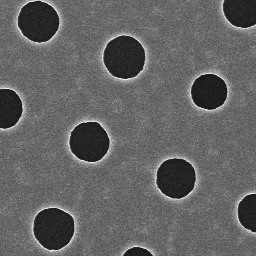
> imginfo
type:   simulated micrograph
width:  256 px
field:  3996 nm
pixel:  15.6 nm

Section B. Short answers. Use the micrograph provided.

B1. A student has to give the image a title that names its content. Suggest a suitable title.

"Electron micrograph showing holes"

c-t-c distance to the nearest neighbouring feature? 1430 nanometres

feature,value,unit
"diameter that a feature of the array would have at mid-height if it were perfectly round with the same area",632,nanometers